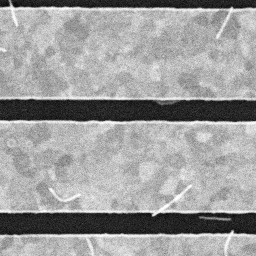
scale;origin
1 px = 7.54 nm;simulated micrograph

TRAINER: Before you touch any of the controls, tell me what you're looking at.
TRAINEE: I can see lines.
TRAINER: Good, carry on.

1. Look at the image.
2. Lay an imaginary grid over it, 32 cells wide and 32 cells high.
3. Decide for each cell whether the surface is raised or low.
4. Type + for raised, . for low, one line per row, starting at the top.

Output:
................................
++++++++++++++++++++++++++++++++
++++++++++++++++++++++++++++++++
++++++++++++++++++++++++++++++++
++++++++++++++++++++++++++++++++
++++++++++++++++++++++++++++++++
++++++++++++++++++++++++++++++++
++++++++++++++++++++++++++++++++
++++++++++++++++++++++++++++++++
++++++++++++++++++++++++++++++++
++++++++++++++++++++++++++++++++
++++++++++++++++++++++++++++++++
................................
................................
................................
++++++++++++++++++++++++++++++++
++++++++++++++++++++++++++++++++
++++++++++++++++++++++++++++++++
++++++++++++++++++++++++++++++++
++++++++++++++++++++++++++++++++
++++++++++++++++++++++++++++++++
++++++++++++++++++++++++++++++++
++++++++++++++++++++++++++++++++
++++++++++++++++++++++++++++++++
++++++++++++++++++++++++++++++++
++++++++++++++++++++++++++++++++
++++++++++++++++++++++++++++++++
................................
................................
++++++++++++++++++++++++++++++++
++++++++++++++++++++++++++++++++
++++++++++++++++++++++++++++++++